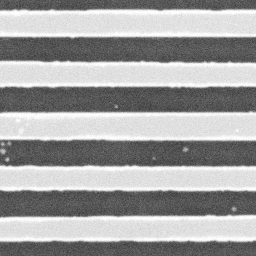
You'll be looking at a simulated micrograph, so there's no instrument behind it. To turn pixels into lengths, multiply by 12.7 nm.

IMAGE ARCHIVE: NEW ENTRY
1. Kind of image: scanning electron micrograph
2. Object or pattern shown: lines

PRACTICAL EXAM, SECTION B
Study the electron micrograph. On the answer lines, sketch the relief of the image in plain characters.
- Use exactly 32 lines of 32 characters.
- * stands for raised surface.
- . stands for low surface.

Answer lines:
................................
.*******************************
********************************
********************************
.**************...*.************
................................
................................
................................
********************************
********************************
********************************
................................
................................
................................
********************************
********************************
********************************
................................
................................
................................
................................
********************************
********************************
********************************
................................
................................
................................
********************************
********************************
********************************
................................
................................